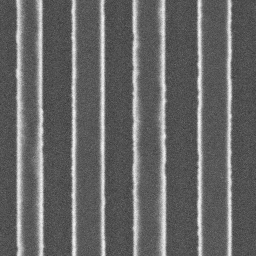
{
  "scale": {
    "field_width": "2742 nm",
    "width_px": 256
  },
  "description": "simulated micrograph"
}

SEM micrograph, lines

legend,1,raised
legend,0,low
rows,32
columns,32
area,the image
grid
00111000011110000111000001111000
00111000011110000111000001111000
00111000011110000111000001111000
00111000011110000111000001111000
00111000011110000111000001111000
00111000011110000111100001111000
00111000011110000111000001111000
00111000011110000111000001111000
00111000011110000111000001111000
00111000011110000111000001111000
00111000011110000111100001111000
00111000011110000111100001111000
00111000011110000111100001111000
00111000011110000111000001111000
00111000011110000111000001111000
00111000011110000111000001111000
00111000011110000111100001111000
00111000011110000111100001111000
00111000011110000111100001111000
00111000011110000111100001111000
00111000011110000111100001111000
00111000011110000111100001111000
00111000011110000111100001111000
00111000011110000111100001111000
00111000011110000111100001111000
00111000011110000111000001111000
00111000011110000111000001111000
00111000011110000111100001111000
00111000011110000111100001111000
00111000011110000111100001111000
00111000011110000111100001111000
00111000011110000111100001111000